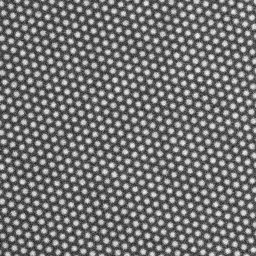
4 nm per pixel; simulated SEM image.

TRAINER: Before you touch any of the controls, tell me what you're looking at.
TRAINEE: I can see a regular array of raised bodies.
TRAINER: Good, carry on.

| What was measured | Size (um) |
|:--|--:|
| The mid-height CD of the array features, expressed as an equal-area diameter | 0.0186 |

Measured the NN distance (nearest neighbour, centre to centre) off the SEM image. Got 37.2 nanometres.